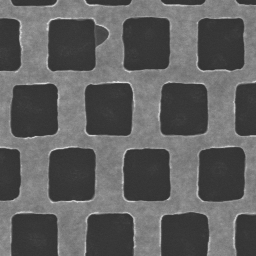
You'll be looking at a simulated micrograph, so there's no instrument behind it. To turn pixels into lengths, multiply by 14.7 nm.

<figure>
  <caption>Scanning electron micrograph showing a regular array of holes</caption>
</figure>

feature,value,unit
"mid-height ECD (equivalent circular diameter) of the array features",812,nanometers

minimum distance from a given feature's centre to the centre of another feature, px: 74.3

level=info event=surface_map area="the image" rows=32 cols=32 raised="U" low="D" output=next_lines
UUDDDDDUUUUDDDDDUUUUUDDDDUUUUUDD
UUUUUUUUUUUUUUUUUUUUUUUUUUUUUUUU
DDUUUUUDDDDUUUUUDDDDDUUUUDDDDDUU
DDUUUUDDDDDDDUUDDDDDDUUUUDDDDDDU
DDUUUUDDDDDDDUUDDDDDDUUUUDDDDDUU
DDUUUUDDDDDDDUUDDDDDDUUUUDDDDDDU
DDDUUUDDDDDDUUUDDDDDDUUUUDDDDDDU
DDDUUUDDDDDDUUUDDDDDDUUUUDDDDDDU
DDUUUUDDDDDDUUUUDDDDDUUUUDDDDDUU
UUUUUUUUUUUUUUUUUUUUUUUUUUUUUUUU
UUUUUUDUUUUUUDDDUUUUUDDDDUUUUUDD
UUDDDDDUUUUDDDDDDUUUDDDDDDUUUDDD
UUDDDDDUUUUDDDDDDUUUDDDDDDUUUDDD
UDDDDDDUUUUDDDDDDUUUDDDDDDUUUDDD
UDDDDDDUUUUDDDDDUUUUDDDDDDUUUDDD
UDDDDDDUUUUDDDDDUUUUDDDDDDUUUDDD
UUDDDDDUUUUDDDDDUUUUDDDDDDUUUUDD
UUUUUUUUUUUUUUUUUUUUUUUUUUUUUUUU
DUUUUUUUDDDUUUUUUUUUUUUUUUUUUDUU
DDDUUUDDDDDDUUUUDDDDDUUUUDDDDDDU
DDDUUUDDDDDDUUUDDDDDDUUUUDDDDDDU
DDDUUUDDDDDDUUUDDDDDDUUUUDDDDDDU
DDDUUUDDDDDDUUUDDDDDDUUUUDDDDDDU
DDDUUUDDDDDDUUUDDDDDDUUUUDDDDDDU
DDUUUUDDDDDDUUUUDDDDDUUUUDDDDDUU
UUUUUUUUUUUUUUUUUUUUUUUUUUUUUUUU
UUUUUUUUUUUUUUUUUUUUUUUUUUUUUUUU
UDDDDDDUUUUDDDDDDUUUDDDDDDUUUDDD
UDDDDDDUUUUDDDDDDUUUDDDDDDUUUDDD
UDDDDDDUUUUDDDDDDUUUDDDDDDUUUDDD
UDDDDDDUUUUDDDDDDUUUDDDDDDUUUDDD
UDDDDDDUUUUDDDDDDUUUDDDDDDUUUDDD